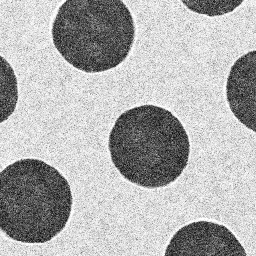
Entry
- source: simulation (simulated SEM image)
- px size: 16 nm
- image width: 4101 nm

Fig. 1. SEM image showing holes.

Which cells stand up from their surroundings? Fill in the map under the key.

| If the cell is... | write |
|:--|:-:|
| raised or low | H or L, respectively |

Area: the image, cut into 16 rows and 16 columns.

HHHHLLLLHHHHLLLH
HHHLLLLLHHHHHHHH
HHHLLLLLHHHHHHHH
HHHHLLLLHHHHHHHL
LHHHHLHHHHHHHHLL
LHHHHHHHHHHHHHLL
LHHHHHHHHHHHHHLL
HHHHHHHLLLLHHHHL
HHHHHHHLLLLLHHHH
HHHHHHHLLLLLHHHH
LLLHHHHLLLLLHHHH
LLLLHHHHLLLHHHHH
LLLLLHHHHHHHHHHH
LLLLHHHHHHHHHHHH
LLLLHHHHHHHLLLHH
HHHHHHHHHHLLLLLH